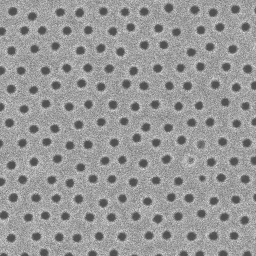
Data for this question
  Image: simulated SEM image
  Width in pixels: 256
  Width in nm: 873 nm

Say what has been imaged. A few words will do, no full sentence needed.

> a regular array of holes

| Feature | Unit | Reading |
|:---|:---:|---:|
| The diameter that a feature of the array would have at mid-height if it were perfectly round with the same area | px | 8.68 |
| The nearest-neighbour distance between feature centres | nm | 63.8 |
